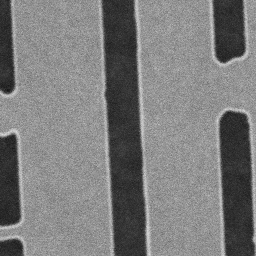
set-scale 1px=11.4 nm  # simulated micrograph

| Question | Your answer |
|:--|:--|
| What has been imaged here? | one or a few lines or trenches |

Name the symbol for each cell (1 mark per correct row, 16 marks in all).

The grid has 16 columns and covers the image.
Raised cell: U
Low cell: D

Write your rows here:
DUUUUUDDDUUUUDDU
DUUUUUDDDUUUUDDU
DUUUUUDDDUUUUDDU
DUUUUUDDDUUUUDDU
DUUUUUDDDUUUUUUU
DUUUUUDDDUUUUUUU
UUUUUUUDDUUUUUUU
UUUUUUUDDUUUUUDD
DUUUUUUDDUUUUUDD
DUUUUUUDDUUUUUDD
DUUUUUUDDUUUUUDD
DUUUUUUDDUUUUUDD
DUUUUUUDDUUUUUDD
DUUUUUUDDUUUUUDD
UUUUUUUDDUUUUUDD
DDUUUUUDDUUUUUDD